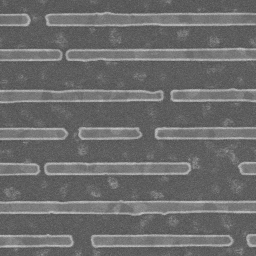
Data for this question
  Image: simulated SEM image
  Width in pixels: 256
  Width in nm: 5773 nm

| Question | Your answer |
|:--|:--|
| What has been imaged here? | parallel lines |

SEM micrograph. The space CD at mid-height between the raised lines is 600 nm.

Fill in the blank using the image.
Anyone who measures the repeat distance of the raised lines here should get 833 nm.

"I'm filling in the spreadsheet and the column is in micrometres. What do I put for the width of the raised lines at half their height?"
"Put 0.234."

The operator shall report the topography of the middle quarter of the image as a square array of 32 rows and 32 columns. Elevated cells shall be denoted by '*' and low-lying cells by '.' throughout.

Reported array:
................................
................................
................................
................................
................................
................................
................................
************************...*****
************************...*****
................................
................................
................................
................................
................................
................................
................................
....**************.....*********
*...***************....*********
.....*******...................*
................................
................................
................................
................................
................................
................................
*******************************.
*******************************.
................................
................................
................................
................................
................................